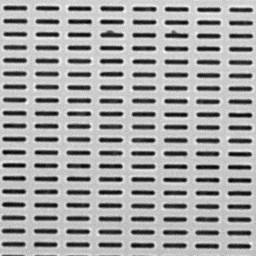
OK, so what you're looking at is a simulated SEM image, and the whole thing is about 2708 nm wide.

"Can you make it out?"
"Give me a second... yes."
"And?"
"a regular array of holes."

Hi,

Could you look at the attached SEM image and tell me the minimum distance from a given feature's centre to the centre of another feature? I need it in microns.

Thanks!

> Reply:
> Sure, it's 0.138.